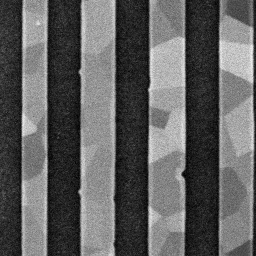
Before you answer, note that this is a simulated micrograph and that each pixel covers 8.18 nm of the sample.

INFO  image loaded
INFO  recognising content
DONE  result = one or a few lines or trenches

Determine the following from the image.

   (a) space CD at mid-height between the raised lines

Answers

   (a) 285 nm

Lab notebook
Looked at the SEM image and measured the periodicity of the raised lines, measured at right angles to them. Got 549 nm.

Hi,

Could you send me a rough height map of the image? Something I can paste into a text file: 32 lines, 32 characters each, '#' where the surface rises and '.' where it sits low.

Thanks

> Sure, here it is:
...###....####.....####.....####
...###....####.....####.....####
...###....####.....####.....####
...###....####.....####.....####
...###....####.....####.....####
...###....####.....####.....####
...###....####.....####.....####
...###....####.....####.....####
...###....####.....####.....####
...###....####.....####.....####
...###....####.....####.....####
...###....####.....####.....####
...###....####.....####.....####
...###....####.....####.....####
...###....####.....####.....####
...###....####.....####.....####
...###....####.....####....#####
...###....####.....####....#####
...###....####.....####....#####
...###....####.....####....#####
...###....####.....####....#####
...###....####.....####....#####
...###....####.....####....#####
...###....####.....####....#####
...###....####.....####....#####
...###....####.....####....#####
...###....####.....####....####.
...###....####.....####....####.
...###....####.....####....####.
...###....####.....####....####.
...###....####.....####....####.
...###....####.....####....####.